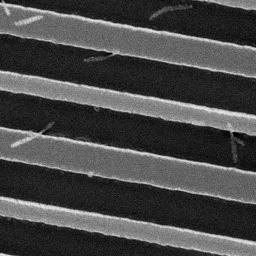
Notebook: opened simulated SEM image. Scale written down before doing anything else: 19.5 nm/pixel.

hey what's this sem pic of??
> lines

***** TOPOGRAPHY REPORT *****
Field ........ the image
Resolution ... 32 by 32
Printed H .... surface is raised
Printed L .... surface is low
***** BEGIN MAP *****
HLLLLLLLLLLLLLLLLLLLLLLLLLLHHHHH
HHHHHHHLLLLLLLLLLLLLLLLLLLLLLLLL
HHHHHHHHHHHHLLLLLLLLLLLLLLLLLLLL
HHHHHHHHHHHHHHHHHHLLLLLLLLLLLLLL
LLHHHHHHHHHHHHHHHHHHHHHLLLLLLLLL
LLLLLLLLHHHHHHHHHHHHHHHHHHHHHLLL
LLLLLLLLLLLLLHHHHHHHHHHHHHHHHHHH
LLLLLLLLLLLLLLLLLLLHHHHHHHHHHHHH
LLLLLLLLLLLLLLLLLLLLLLLLLHHHHHHH
HHHHLLLLLLLLLLLLLLLLLLLLLLLLLLLH
HHHHHHHHHLLLLLLLLLLLLLLLLLLLLLLL
LLHHHHHHHHHHHHHLLLLLLLLLLLLLLLLL
LLLLLLLHHHHHHHHHHHHHLLLLLLLLLLLL
LLLLLLLLLLLLLHHHHHHHHHHHHHLLLLLL
LLLLLLLLLLLLLLLLLLLHHHHHHHHHHHHL
LLLLLLLLLLLLLLLLLLLLLLLLHHHHHHHH
HHHHLLLLLLLLLLLLLLLLLLLLLLLLLHHH
HHHHHHHHHLLLLLLLLLLLLLLLLLLLLLLL
HHHHHHHHHHHHHHHLLLLLLLLLLLLLLLLL
HHHHHHHHHHHHHHHHHHHHHLLLLLLLLLLL
LLLHHHHHHHHHHHHHHHHHHHHHHHLLLLLL
LLLLLLLLLHHHHHHHHHHHHHHHHHHHHHHH
LLLLLLLLLLLLLLLHHHHHHHHHHHHHHHHH
LLLLLLLLLLLLLLLLLLLLLHHHHHHHHHHH
LLLLLLLLLLLLLLLLLLLLLLLLLLHHHHHH
HHHHLLLLLLLLLLLLLLLLLLLLLLLLLLLL
HHHHHHHHHHLLLLLLLLLLLLLLLLLLLLLL
LLLHHHHHHHHHHHHHLLLLLLLLLLLLLLLL
LLLLLLLLLHHHHHHHHHHHHHLLLLLLLLLL
LLLLLLLLLLLLLLLHHHHHHHHHHHHLLLLL
LLLLLLLLLLLLLLLLLLLLHHHHHHHHHHHH
LLLLLLLLLLLLLLLLLLLLLLLLLLHHHHHH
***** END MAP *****